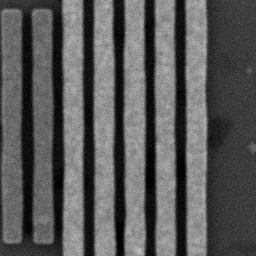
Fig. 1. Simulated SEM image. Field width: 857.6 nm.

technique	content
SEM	groups of lines, slits or small figures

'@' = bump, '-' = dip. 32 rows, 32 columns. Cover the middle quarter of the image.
@@@@----@@@@---@@@@@---@@@@@---@
@@@@----@@@@---@@@@@---@@@@@---@
@@@@----@@@@---@@@@@---@@@@@---@
@@@@----@@@@---@@@@@---@@@@@---@
@@@@----@@@@---@@@@@---@@@@@---@
@@@@----@@@@---@@@@@---@@@@@---@
@@@@----@@@@---@@@@@---@@@@@---@
@@@@----@@@@---@@@@@---@@@@@---@
@@@@----@@@@---@@@@@---@@@@@---@
@@@@----@@@@---@@@@@---@@@@@---@
@@@@@---@@@@---@@@@@---@@@@@---@
@@@@@---@@@@---@@@@@---@@@@@---@
@@@@@---@@@@---@@@@@---@@@@@---@
@@@@@---@@@@---@@@@@---@@@@----@
@@@@@---@@@@---@@@@@---@@@@----@
@@@@@---@@@@---@@@@@---@@@@----@
@@@@@---@@@@---@@@@@---@@@@----@
@@@@@---@@@@---@@@@@---@@@@----@
@@@@@---@@@@---@@@@@---@@@@----@
@@@@@---@@@@---@@@@@---@@@@@---@
@@@@----@@@@---@@@@@---@@@@@---@
@@@@----@@@@---@@@@@---@@@@@---@
@@@@----@@@@---@@@@@---@@@@@---@
@@@@----@@@@---@@@@@---@@@@@---@
@@@@----@@@@----@@@@---@@@@@---@
@@@@----@@@@---@@@@@---@@@@@---@
@@@@----@@@@---@@@@@---@@@@@---@
@@@@----@@@@---@@@@@---@@@@@---@
@@@@----@@@@---@@@@@---@@@@@---@
@@@@@---@@@@---@@@@@---@@@@@---@
@@@@@---@@@@---@@@@@---@@@@@---@
@@@@@---@@@@---@@@@@---@@@@@---@